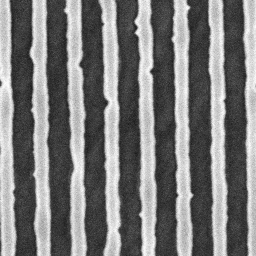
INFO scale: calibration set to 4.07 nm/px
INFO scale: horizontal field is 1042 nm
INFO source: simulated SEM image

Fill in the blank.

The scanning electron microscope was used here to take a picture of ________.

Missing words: parallel lines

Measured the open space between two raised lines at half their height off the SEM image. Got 94.6 nanometres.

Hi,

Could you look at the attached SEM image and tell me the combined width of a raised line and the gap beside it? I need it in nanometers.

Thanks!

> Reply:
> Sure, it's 144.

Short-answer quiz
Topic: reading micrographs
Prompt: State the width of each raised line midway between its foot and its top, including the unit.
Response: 0.0509 microns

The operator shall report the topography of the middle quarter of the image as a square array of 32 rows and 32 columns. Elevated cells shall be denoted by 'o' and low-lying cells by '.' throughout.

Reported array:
.ooo......ooo......ooo......ooo.
.ooo......ooo......oo.......ooo.
.ooo......ooo......ooo......ooo.
.ooo......ooo......ooo......ooo.
..oo......ooo......ooo......ooo.
.ooo......ooo......ooo......ooo.
.ooo......ooo......ooo......ooo.
.ooo......ooo......ooo......ooo.
.ooo.......oo......ooo......ooo.
.oooo......oo......ooo......ooo.
..ooo......ooo.....ooo......ooo.
..ooo.....oooo.....ooo......ooo.
..ooo.....oooo.....ooo......ooo.
..ooo.....oooo.....ooo......ooo.
..ooo.....oooo.....ooo......ooo.
..ooo.....ooo......ooo......ooo.
..ooo.....ooo......ooo......ooo.
..ooo......oo......ooo......ooo.
..ooo......oo......ooo......ooo.
..ooo......oo......ooo......ooo.
..ooo......oo......ooo......ooo.
..ooo......oo.......oo......ooo.
..ooo......ooo......oo......ooo.
..ooo......oo......oooo.....ooo.
...oo......oo......oooo.....ooo.
...oo......oo.......ooo.....ooo.
...oo......ooo.....ooo......ooo.
..ooo......ooo.....ooo......ooo.
..ooo......oo......ooo......ooo.
..oo.......oo......oooo.....ooo.
..ooo......oo......oooo.....ooo.
..ooo......oo......oooo.....ooo.